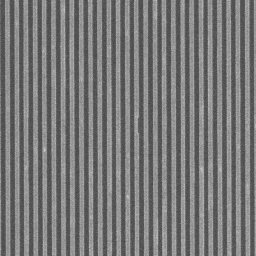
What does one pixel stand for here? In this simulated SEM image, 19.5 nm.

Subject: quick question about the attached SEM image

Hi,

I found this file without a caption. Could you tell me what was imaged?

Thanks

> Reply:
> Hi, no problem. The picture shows parallel lines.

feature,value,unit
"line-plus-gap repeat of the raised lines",0.18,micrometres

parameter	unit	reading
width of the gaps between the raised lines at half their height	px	5.25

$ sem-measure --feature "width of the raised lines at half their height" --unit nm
80.5